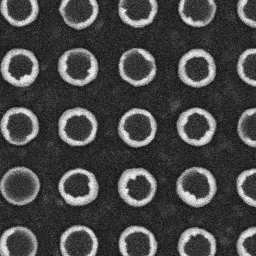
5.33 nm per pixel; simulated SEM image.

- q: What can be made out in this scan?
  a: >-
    a regular array of raised bodies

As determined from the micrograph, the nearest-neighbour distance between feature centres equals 58.4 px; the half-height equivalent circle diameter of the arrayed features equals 36.4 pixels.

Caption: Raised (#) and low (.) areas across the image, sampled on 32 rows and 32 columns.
#####...####...####....####...##
#####...####...####...#####...##
.###....####....###....###....##
................................
................................
................................
.##......##.....##......#......#
.####...####...####....###....##
#####...####...####...#####...##
.####...####...####....####...##
..#..............#......##.....#
................................
................................
................................
.###....###.....###....###....##
#####...####...####...#####...##
#####...####...####...#####...##
.###....###.....###....###.....#
................................
................................
................................
.###.....##.....##.....###.....#
#####...####...####...#####...##
#####..#####...####...#####...##
.###....####...####....###....##
........................#......#
................................
................................
.........##.....##..............
####....####...####....###....##
####....####...####...#####...##
####....####...####....####...##